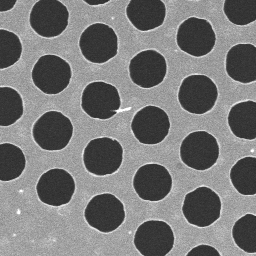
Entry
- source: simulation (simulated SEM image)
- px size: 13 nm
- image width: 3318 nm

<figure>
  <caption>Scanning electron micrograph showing a regular array of holes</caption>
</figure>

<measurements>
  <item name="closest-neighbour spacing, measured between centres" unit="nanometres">720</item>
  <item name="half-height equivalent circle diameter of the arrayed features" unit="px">38.9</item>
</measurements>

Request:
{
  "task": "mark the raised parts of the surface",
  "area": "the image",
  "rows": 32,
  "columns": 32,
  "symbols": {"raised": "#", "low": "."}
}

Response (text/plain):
..##....###..###....########....
####.....#######.....#######....
####.....#######....###...###...
####....###...###..###.....#####
..###..###.....#######.....#####
...#######.....#######.....###.#
...#######.....###..###...###...
..###...###...##.....#######....
.###.....#######.....#######....
####.....#######.....###..###...
####.....##...###...###....#####
..###..###.....#######.....#####
...#######.....#######.....#####
...#######.....###..###...###...
...##...###...###....#######....
..##.....#######.....########...
####.....########....###..###...
####.....###..###...###....#####
..###...###....########....#####
...#######.....########....#####
...########....####.###....##...
...###..###...###....########...
.####....########....########...
#####....########....####.###...
#####....###..###....##....#####
######..###....########.....####
###########.....#######.....####
###########....########....###..
############...##....########...
#################.....#######...
#################.....########..
#################....###...####.